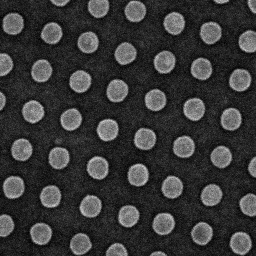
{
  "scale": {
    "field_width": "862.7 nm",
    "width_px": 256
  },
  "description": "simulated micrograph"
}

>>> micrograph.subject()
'a regular array of raised bodies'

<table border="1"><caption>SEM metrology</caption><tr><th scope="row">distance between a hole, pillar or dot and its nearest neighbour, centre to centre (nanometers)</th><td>129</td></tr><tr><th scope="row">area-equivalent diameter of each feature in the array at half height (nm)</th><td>69.6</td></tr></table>